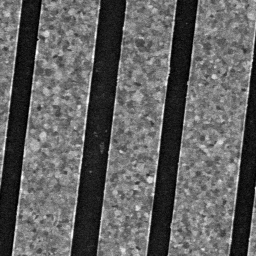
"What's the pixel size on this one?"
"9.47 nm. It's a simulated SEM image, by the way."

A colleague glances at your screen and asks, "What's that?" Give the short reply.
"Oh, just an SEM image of one or a few lines or trenches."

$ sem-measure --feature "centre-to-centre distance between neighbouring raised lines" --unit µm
0.742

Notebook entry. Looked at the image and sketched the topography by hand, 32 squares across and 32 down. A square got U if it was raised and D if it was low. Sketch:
UUUDDUUUUUUUDDDDUUUUUUDDDUUUUUUU
UUUDDUUUUUUUDDDDUUUUUUDDDUUUUUUU
UUDDDUUUUUUUDDDDUUUUUUDDUUUUUUUU
UUDDDUUUUUUUDDDUUUUUUUDDUUUUUUUU
UUDDDUUUUUUUDDDUUUUUUUDDUUUUUUUU
UUDDDUUUUUUUDDDUUUUUUUDDUUUUUUUU
UUDDUUUUUUUUDDDUUUUUUDDDUUUUUUUU
UUDDUUUUUUUUDDDUUUUUUDDDUUUUUUUU
UUDDUUUUUUUUDDDUUUUUUDDDUUUUUUUD
UUDDUUUUUUUDDDDUUUUUUDDDUUUUUUUD
UDDDUUUUUUUDDDDUUUUUUDDUUUUUUUUD
UDDDUUUUUUUDDDDUUUUUUDDUUUUUUUUD
UDDDUUUUUUUDDDUUUUUUUDDUUUUUUUUD
UDDDUUUUUUUDDDUUUUUUDDDUUUUUUUUD
UDDDUUUUUUUDDDUUUUUUDDDUUUUUUUUD
UDDUUUUUUUUDDDUUUUUUDDDUUUUUUUUD
UDDUUUUUUUUDDDUUUUUUDDDUUUUUUUDD
UDDUUUUUUUUDDDUUUUUUDDDUUUUUUUDD
UDDUUUUUUUDDDDUUUUUUDDDUUUUUUUDD
DDDUUUUUUUDDDDUUUUUUDDUUUUUUUUDD
DDDUUUUUUUDDDUUUUUUUDDUUUUUUUUDD
DDDUUUUUUUDDDUUUUUUUDDUUUUUUUUDD
DDDUUUUUUUDDDUUUUUUUDDUUUUUUUUDD
DDDUUUUUUUDDDUUUUUUDDDUUUUUUUUDD
DDUUUUUUUUDDDUUUUUUDDDUUUUUUUDDD
DDUUUUUUUUDDDUUUUUUDDDUUUUUUUDDD
DDUUUUUUUDDDDUUUUUUDDDUUUUUUUDDD
DDUUUUUUUDDDDUUUUUUDDUUUUUUUUDDD
DDUUUUUUUDDDDUUUUUUDDUUUUUUUUDDU
DDUUUUUUUDDDUUUUUUUDDUUUUUUUUDDU
DDUUUUUUUDDDUUUUUUDDDUUUUUUUUDDU
DDUUUUUUUDDDUUUUUUDDDUUUUUUUUDDU